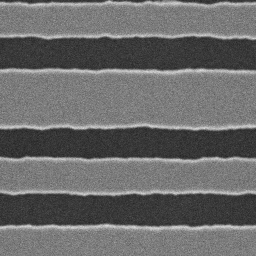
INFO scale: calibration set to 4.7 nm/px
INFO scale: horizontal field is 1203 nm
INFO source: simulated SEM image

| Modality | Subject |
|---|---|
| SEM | lines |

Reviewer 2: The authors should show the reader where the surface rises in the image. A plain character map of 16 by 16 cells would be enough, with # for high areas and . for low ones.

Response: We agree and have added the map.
################
################
................
................
################
################
################
################
................
................
################
################
................
................
################
################